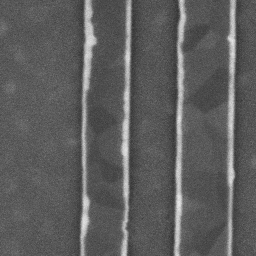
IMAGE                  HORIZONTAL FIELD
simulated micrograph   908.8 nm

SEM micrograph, one or a few lines or trenches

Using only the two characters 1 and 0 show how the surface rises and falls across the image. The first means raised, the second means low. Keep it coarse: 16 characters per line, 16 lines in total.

0000011100011110
0000011100011110
0000011100011110
0000011100011110
0000011100011110
0000011100011110
0000011100011110
0000011100011110
0000011100011110
0000011100011100
0000011100011110
0000011100011110
0000011100011100
0000011100011100
0000011100011100
0000011100011100